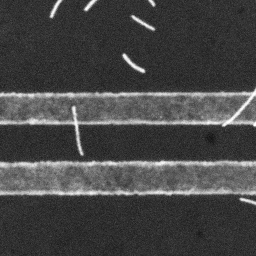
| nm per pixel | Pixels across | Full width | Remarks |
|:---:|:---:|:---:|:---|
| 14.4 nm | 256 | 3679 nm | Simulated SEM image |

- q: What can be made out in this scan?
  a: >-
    lines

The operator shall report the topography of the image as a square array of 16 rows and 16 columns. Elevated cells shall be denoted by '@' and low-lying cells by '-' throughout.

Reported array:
----------------
----------------
----------------
----------------
----------------
----------------
@@@@@@@@@@@@@@@@
@@@@@@@@@@@@@@@@
----------------
----------------
@@@@@@@@@@@@@@@@
@@@@@@@@@@@@@@@@
----------------
----------------
----------------
----------------